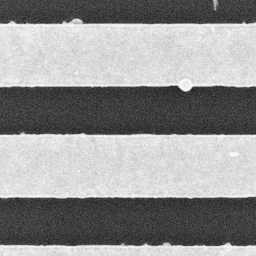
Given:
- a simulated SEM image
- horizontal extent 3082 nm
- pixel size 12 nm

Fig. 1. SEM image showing lines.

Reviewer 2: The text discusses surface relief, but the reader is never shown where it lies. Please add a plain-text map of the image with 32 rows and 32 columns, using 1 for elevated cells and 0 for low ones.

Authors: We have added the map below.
00000000000000000000000000000000
00000000000000000000000000000000
00000000000000000000000000000000
11111111111111111111111111111111
11111111111111111111111111111111
11111111111111111111111111111111
11111111111111111111111111111111
11111111111111111111111111111111
11111111111111111111111111111111
11111111111111111111111111111111
11111111111111111111111111111111
00000000000000000000000000000000
00000000000000000000000000000000
00000000000000000000000000000000
00000000000000000000000000000000
00000000000000000000000000000000
00000000000000000000000000000000
11111111111111111111111111111111
11111111111111111111111111111111
11111111111111111111111111111111
11111111111111111111111111111111
11111111111111111111111111111111
11111111111111111111111111111111
11111111111111111111111111111111
11111111111111111111111111111111
00000000000000000000000000000000
00000000000000000000000000000000
00000000000000000000000000000000
00000000000000000000000000000000
00000000000000000000000000000000
00000000000000000000000000000000
11111111111111111111111111111111